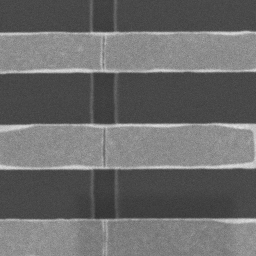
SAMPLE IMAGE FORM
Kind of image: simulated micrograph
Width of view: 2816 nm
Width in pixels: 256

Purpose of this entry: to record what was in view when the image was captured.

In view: wiring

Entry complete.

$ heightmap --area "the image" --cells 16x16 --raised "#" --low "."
................
................
################
################
##....###.......
................
................
................
################
################
.###..####......
................
................
................
################
################